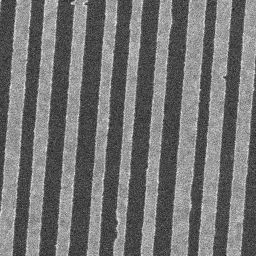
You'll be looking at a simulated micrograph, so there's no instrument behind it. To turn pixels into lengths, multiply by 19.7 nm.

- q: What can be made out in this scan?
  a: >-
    parallel lines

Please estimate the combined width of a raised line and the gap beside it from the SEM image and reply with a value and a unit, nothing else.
563 nanometres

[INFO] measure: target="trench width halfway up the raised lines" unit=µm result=0.337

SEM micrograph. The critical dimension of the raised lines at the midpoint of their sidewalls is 243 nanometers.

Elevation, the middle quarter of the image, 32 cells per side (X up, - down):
--XXX----XXX----XX-----XXX----XX
--XX-----XXX----XX-----XXX----XX
-XXX-----XXX----XX-----XXX----XX
-XXX-----XXX----XX-----XX-----XX
-XXX-----XXX----XX-----XX-----XX
-XXX-----XX-----XX-----XX-----XX
-XXX-----XX-----XX-----XX-----XX
-XXX-----XX-----XX-----XX-----XX
-XXX-----XX----XXX----XXX-----XX
-XXX-----XX----XXX----XXX-----XX
-XXX-----XX----XXX----XXX-----XX
-XXX-----XX----XX-----XXX----XXX
-XXX-----XX----XX-----XXX----XXX
-XX------XX----XX-----XXX----XXX
-XX-----XXX----XX-----XXX----XXX
-XX-----XXX----XX-----XXX----XXX
XXX-----XXX----XX-----XX-----XXX
XXX-----XXX----XX-----XX-----XXX
XXX-----XXX----XX-----XX-----XXX
XXX-----XX-----XX-----XX-----XXX
XXX-----XXX----XX----XXX-----XXX
XXX-----XX----XXX----XXX-----XXX
XXX-----XX----XXX----XXX----XXXX
XXX-----XX----XXX----XXX-----XXX
XXX-----XX----XXX----XXX----XXXX
XXX-----XX----XX-----XXX----XXXX
XXX-----XX----XX-----XXX----XXXX
XXX----XXX----XX-----XXX----XXXX
XX-----XXX----XX-----XX-----XXXX
XX-----XXX----XX-----XX-----XXXX
XX-----XXX----XX-----XX-----XXXX
XX-----XXX----XX-----XX-----XXXX